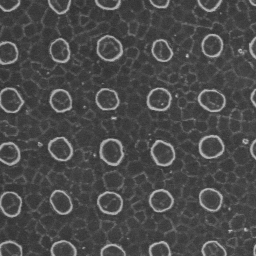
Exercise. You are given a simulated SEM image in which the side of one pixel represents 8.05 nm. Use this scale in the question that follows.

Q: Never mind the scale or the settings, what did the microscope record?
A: a regular array of raised bodies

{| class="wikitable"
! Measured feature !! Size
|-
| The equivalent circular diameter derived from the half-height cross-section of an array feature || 182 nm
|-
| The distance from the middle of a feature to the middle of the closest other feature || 393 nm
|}